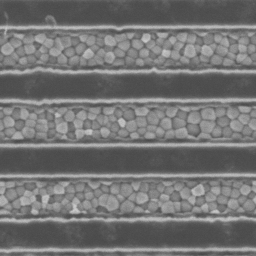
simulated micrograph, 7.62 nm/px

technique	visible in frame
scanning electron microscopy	one or a few lines or trenches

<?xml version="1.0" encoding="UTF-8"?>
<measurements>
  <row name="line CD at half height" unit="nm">237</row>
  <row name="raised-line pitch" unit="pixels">74.4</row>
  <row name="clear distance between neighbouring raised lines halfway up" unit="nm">327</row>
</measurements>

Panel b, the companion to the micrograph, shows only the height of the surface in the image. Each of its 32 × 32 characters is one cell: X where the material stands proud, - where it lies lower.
XXXXXXXXXXXXXXXXXXXXXXXXXXXXXXXX
XXXXXXXXXXXXXXXXXXXXXXXXXXXXXXXX
XXXXXXXXXXXXXXXXXXXXXXXXXXXXXXXX
X-XX--XXXXX---XX----------------
--------------------------------
--------------------------------
--------------------------------
--------------------------------
--------------------------------
XXXXXXXXXXXXXXXXXXXXXXXXXXXXXXXX
XXXXXXXXXXXXXXXXXXXXXXXXXXXXXXXX
XXXXXXXXXXXXXXXXXXXXXXXXXXXXXXXX
XXXXXXXXXXXXXXXXXXXXXXXXXXXXXXXX
--------------------------------
--------------------------------
--------------------------------
--------------------------------
--------------------------------
XXXXXXXXXXXXXXXXXXXXXXXXXXXXXXXX
XXXXXXXXXXXXXXXXXXXXXXXXXXXXXXXX
XXXXXXXXXXXXXXXXXXXXXXXXXXXXXXXX
XXXXXXXXXXXXXXXXXXXXXXXXXXXXXXXX
--------------------------------
--------------------------------
--------------------------------
--------------------------------
--------------------------------
XX--XXXXXXXXXXXXXXXXXXXXXXXXXXXX
XXXXXXXXXXXXXXXXXXXXXXXXXXXXXXXX
XXXXXXXXXXXXXXXXXXXXXXXXXXXXXXXX
XXXXXXXXXXXXXXXXXXXXXXXXXXXXXXXX
--------------------------------